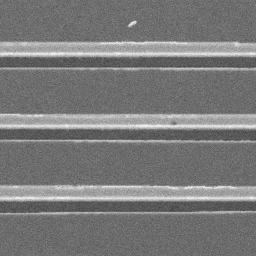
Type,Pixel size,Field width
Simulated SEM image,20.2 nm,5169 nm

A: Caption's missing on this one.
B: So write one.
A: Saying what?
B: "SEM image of lines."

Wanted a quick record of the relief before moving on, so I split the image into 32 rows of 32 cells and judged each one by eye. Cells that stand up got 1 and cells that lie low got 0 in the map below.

11111111111111111111111111111111
11111111111111111111111111111111
11111111111111111111111111111111
11111111111111111111111111111111
11111111111111111111111111111111
11111111111111111111111111111111
11111111111111111111111111111111
00000000000000000000000000000000
00000000000000000000000000000000
11111111111111111111111111111111
11111111111111111111111111111111
11111111111111111111111111111111
11111111111111111111111111111111
11111111111111111111111111111111
11111111111111111111111111111111
11111111111111111111111111111111
00000000000000000000000000000000
00000000000000000000000000000000
11111111111111111111111111111111
11111111111111111111111111111111
11111111111111111111111111111111
11111111111111111111111111111111
11111111111111111111111111111111
11111111111111111111111111111111
11111111111111111111111111111111
00000000000000000000000000000000
00000000000000000000000000001111
11111111111111111111111111111111
11111111111111111111111111111111
11111111111111111111111111111111
11111111111111111111111111111111
11111111111111111111111111111111